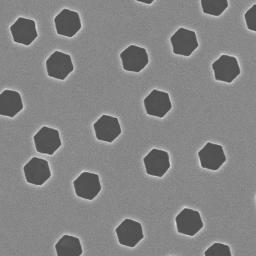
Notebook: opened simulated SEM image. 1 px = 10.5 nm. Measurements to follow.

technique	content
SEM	a regular array of holes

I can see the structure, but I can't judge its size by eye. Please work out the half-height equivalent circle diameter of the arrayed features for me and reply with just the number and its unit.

281 nanometres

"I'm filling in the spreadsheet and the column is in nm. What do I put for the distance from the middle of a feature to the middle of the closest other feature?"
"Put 534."